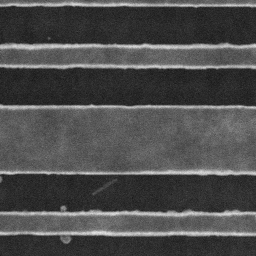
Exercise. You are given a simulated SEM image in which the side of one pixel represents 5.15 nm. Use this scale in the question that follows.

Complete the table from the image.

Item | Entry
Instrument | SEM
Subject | lines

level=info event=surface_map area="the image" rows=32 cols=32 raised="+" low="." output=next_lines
++++++++++++++++++++++++++++++++
................................
................................
................................
................................
................................
++++++++++++++++++++++++++++++++
++++++++++++++++++++++++++++++++
.......................++.......
................................
................................
................................
................................
++++++++++++++++++++++++++++++++
++++++++++++++++++++++++++++++++
++++++++++++++++++++++++++++++++
++++++++++++++++++++++++++++++++
++++++++++++++++++++++++++++++++
++++++++++++++++++++++++++++++++
++++++++++++++++++++++++++++++++
++++++++++++++++++++++++++++++++
++++++++++++++++++++++++++++++++
................................
................................
................................
................................
................................
++++++++++++++++++++++++++++++++
++++++++++++++++++++++++++++++++
................................
................................
................................